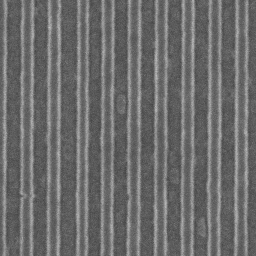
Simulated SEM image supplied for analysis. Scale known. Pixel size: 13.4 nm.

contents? parallel lines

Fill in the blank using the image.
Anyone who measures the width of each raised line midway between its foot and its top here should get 149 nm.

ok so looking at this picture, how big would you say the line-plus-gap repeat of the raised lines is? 0.359 microns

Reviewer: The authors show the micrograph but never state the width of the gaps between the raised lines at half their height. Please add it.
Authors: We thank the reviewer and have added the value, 15.9 pixels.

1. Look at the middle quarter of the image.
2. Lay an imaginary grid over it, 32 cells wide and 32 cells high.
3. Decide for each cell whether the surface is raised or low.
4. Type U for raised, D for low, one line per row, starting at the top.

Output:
DDDDUUDDDDUUDDDDUUUDDDDUUUDDDDUU
DDDDUUDDDDUUDDDDUUUDDDDUUUDDDDUU
DDDDUUDDDDUUDDDDUUUDDDDUUUDDDDUU
DDDDUUDDDDUUDDDDUUUDDDDUUUDDDDUU
DDDDUUDDDDUUDDDDUUUDDDDUUUDDDDUU
DDDDUUDDDDUUDDDDUUUDDDDUUUDDDDUU
DDDDUUDDDDUUDDDDUUUDDDDUUUDDDDUU
DDDDUUDDDDUUDDDDUUUDDDDUUUDDDDUU
DDDDUUDDDDUUDDDDUUUDDDDUUUDDDDUU
DDDDUUDDDDUUDDDDUUUDDDDUUUDDDDUU
DDDDUUDDDDUUDDDDUUUDDDDUUDDDDDUU
DDDDUUDDDDUUDDDDUUUDDDDUUDDDDDUU
DDDDUUDDDDUUDDDDUUUDDDDUUDDDDDUU
DDDDUUDDDDUUDDDDUUUDDDDUUDDDDDUU
DDDDUUDDDDUUDDDDUUUDDDDUUDDDDDUU
DDDDUUDDDDUUDDDDUUUDDDDUUDDDDDUU
DDDDUUDDDDUUDDDDUUUDDDDUUDDDDDUU
DDDDUUDDDDUUDDDDUUUDDDDUUDDDDDUU
DDDDUUDDDUUUDDDDUUUDDDDUUDDDDDUU
DDDDUUDDDDUUDDDDUUUDDDDUUUDDDDUU
DDDDUUDDDDUUDDDDUUUDDDDUUUDDDDUU
DDDDUUDDDDUUDDDDUUUDDDDUUUDDDUUU
DDDDUUDDDDUUDDDDUUUDDDDUUDDDDDUU
DDDUUUDDDDUUDDDDUUUDDDDUUDDDDDUU
DDDUUUDDDDUUDDDDUUUDDDDUUDDDDDUU
DDDUUUDDDDUUDDDDUUUDDDDUUDDDDDUU
DDDUUUDDDDUUDDDDUUUDDDDUUDDDDDUU
DDDUUUDDDDUUDDDDUUUDDDDUUDDDDDUU
DDDUUUDDDDUUDDDDUUUDDDDUUDDDDDUU
DDDUUUDDDDUUDDDDUUUDDDDUUDDDDDUU
DDDUUUDDDDUUDDDDUUUDDDDUUDDDDDUU
DDDUUUDDDDUUDDDDUUUDDDDUUDDDDDUU